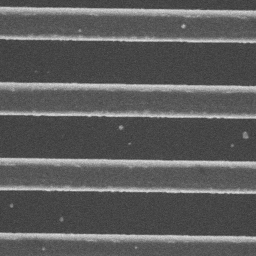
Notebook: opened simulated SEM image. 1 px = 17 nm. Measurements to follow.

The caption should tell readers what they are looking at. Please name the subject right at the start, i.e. lines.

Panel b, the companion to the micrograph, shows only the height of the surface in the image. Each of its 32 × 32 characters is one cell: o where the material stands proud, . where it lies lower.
................................
ooooooooooooooooooooooo.........
oooooooooooooooooooooooooooooooo
oooooooooooooooooooooooooooooooo
oooooooooooooooooooooooooooooooo
................................
................................
................................
................................
................................
................................
oooooooooooooooooooooooooooooooo
oooooooooooooooooooooooooooooooo
oooooooooooooooooooooooooooooooo
.................ooooooooooooooo
................................
................................
................................
................................
................................
oooooooooooooooooooooooooooooooo
oooooooooooooooooooooooooooooooo
oooooooooooooooooooooooooooooooo
oooooooooooooooooooooooooooooooo
................................
................................
................................
................................
................................
oooooooooo......................
oooooooooooooooooooooooooooooooo
oooooooooooooooooooooooooooooooo